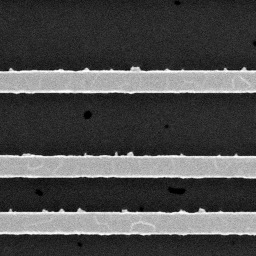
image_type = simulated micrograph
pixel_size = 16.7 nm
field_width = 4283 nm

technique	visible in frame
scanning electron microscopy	lines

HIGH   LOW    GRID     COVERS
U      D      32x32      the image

DDDDDDDDDDDDDDDDDDDDDDDDDDDDDDDD
DDDDDDDDDDDDDDDDDDDDDDDDDDDDDDDD
DDDDDDDDDDDDDDDDDDDDDDDDDDDDDDDD
DDDDDDDDDDDDDDDDDDDDDDDDDDDDDDDD
DDDDDDDDDDDDDDDDDDDDDDDDDDDDDDDD
DDDDDDDDDDDDDDDDDDDDDDDDDDDDDDDD
DDDDDDDDDDDDDDDDDDDDDDDDDDDDDDDD
DDDDDDDDDDDDDDDDDDDDDDDDDDDDDDDD
DDDDDDDDDDDDDDDDDDDDDDDDDDDDDDDD
UUUUUUUUUUUUUUUUUUUUUUUUUUUUUUUU
UUUUUUUUUUUUUUUUUUUUUUUUUUUUUUUU
UUUUUUUUUUUUUUUUUUUUUUUUUUUUUUUU
DDDDDDDDDDDDDDDDDDDDDDDDDDDDDDDD
DDDDDDDDDDDDDDDDDDDDDDDDDDDDDDDD
DDDDDDDDDDDDDDDDDDDDDDDDDDDDDDDD
DDDDDDDDDDDDDDDDDDDDDDDDDDDDDDDD
DDDDDDDDDDDDDDDDDDDDDDDDDDDDDDDD
DDDDDDDDDDDDDDDDDDDDDDDDDDDDDDDD
DDDDDDDDDDDDDDDDDDDDDDDDDDDDDDDD
UUDUUUDUDDUUUUUUUDDUDUUDDDDDDDDD
UUUUUUUUUUUUUUUUUUUUUUUUUUUUUUUU
UUUUUUUUUUUUUUUUUUUUUUUUUUUUUUUU
DDDDDDDDDDDDDDDDDDDDDDDDDDDDDDDD
DDDDDDDDDDDDDDDDDDDDDDDDDDDDDDDD
DDDDDDDDDDDDDDDDDDDDDDDDDDDDDDDD
DDDDDDDDDDDDDDDDDDDDDDDDDDDDDDDD
DUDDDDDUDUUDDDDDDDDDDDDDDUDDDDDD
UUUUUUUUUUUUUUUUUUUUUUUUUUUUUUUU
UUUUUUUUUUUUUUUUUUUUUUUUUUUUUUUU
DDDDDDDDDDDDDDDDDDDDDDDDDDDDDDDD
DDDDDDDDDDDDDDDDDDDDDDDDDDDDDDDD
DDDDDDDDDDDDDDDDDDDDDDDDDDDDDDDD